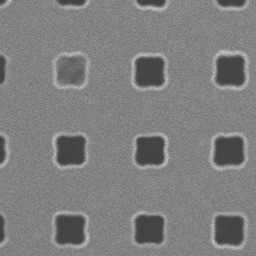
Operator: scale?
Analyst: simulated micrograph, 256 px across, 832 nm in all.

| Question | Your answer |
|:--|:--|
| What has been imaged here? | a regular array of holes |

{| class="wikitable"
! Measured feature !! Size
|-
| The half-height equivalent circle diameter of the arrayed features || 98.6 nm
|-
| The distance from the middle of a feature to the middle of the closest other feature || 78.8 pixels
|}